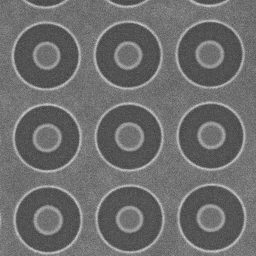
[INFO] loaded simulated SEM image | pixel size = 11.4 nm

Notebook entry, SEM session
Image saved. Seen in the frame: an array of small figures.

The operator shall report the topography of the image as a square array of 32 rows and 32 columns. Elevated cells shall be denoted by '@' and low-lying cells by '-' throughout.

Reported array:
@@@@---@@@@@@@@--@@@@@@@@--@@@@@
@@@@@@@@@@@@@@@@@@@@@@@@@@@@@@@@
@@@@@@@@@@@@@@@@@@@@@@@@@@@@@@@@
@@@@----@@@@@@----@@@@@@-----@@@
@@-------@@@@------@@@@-------@@
@@---@----@@---@@---@@---@@---@@
@@--@@@---@@---@@@--@@---@@@--@@
@@--@@@---@@---@@---@@---@@@--@@
@@--------@@--------@@@-------@@
@@@------@@@@------@@@@------@@@
@@@@----@@@@@@----@@@@@@----@@@@
@@@@@@@@@@@@@@@@@@@@@@@@@@@@@@@@
@@@@@@@@@@@@@@@@@@@@@@@@@@@@@@@@
@@@@----@@@@@@----@@@@@@-----@@@
@@@------@@@@------@@@@-------@@
@@--------@@----@---@@@---@---@@
@@--@@@---@@---@@@--@@---@@@--@@
@@--@@@---@@---@@@--@@---@@@---@
@@---@@---@@---@@---@@@-------@@
@@-------@@@@------@@@@-------@@
@@@-----@@@@@@-----@@@@@-----@@@
@@@@@@@@@@@@@@@@@@@@@@@@@@@@@@@@
@@@@@@@@@@@@@@@@@@@@@@@@@@@@@@@@
@@@@@--@@@@@@@@---@@@@@@@---@@@@
@@@------@@@@------@@@@-------@@
@@--------@@@-------@@@-------@@
@@---@@---@@---@@---@@---@@@--@@
@@--@@@@--@@---@@@--@@---@@@---@
@@---@@---@@---@@---@@@---@---@@
@@--------@@@-------@@@-------@@
@@@------@@@@@-----@@@@@-----@@@
@@@@@--@@@@@@@@@@@@@@@@@@@@@@@@@